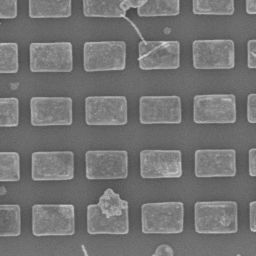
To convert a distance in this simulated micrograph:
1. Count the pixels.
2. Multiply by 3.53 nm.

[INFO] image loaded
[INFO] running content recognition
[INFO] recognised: wiring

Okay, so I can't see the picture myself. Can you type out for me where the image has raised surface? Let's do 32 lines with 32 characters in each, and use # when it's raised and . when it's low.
##..#####.############..#####..#
##..#####..#####.#####..#####..#
................................
................................
................................
##..#####..#####..####..#####..#
##..#####..#####.#####..#####..#
##..#####..#####.#####..#####..#
##..#####..####...####...####...
................................
................................
................................
##..#####..#####..####..#####..#
##..#####..#####..#####.#####..#
##..#####..#####..#####.#####..#
##..#####..####.................
................................
................................
................................
##..#####..#####..#####.#####..#
##..#####..#####..#####.#####..#
##..#####..#####..#####.#####..#
##..............................
................................
.............##.................
............####..#####..####..#
##..#####..#####..#####.######.#
##..#####..#####..#####.######.#
##..#####..#####..#####.######.#
................................
................................
................................